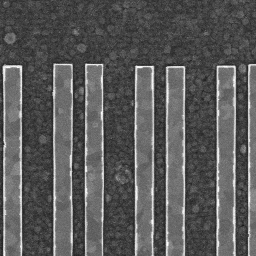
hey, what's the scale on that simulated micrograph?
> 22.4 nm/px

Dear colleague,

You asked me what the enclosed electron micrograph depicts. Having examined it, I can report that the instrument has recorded parallel lines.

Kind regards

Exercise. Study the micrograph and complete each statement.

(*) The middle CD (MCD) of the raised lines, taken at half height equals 386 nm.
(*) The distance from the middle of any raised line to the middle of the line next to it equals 955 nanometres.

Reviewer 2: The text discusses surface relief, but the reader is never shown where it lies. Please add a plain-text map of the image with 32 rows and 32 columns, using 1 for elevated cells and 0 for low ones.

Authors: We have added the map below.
00000000000000000000000000000000
00000000000000000000000000000000
00000000000000000000000000000000
00000000000000000000000000000000
00000000000000000000000000000000
00000000000000000000000000000000
00000000000000000000000000000000
00000000000000000000000000000000
01000001100110000110011000011001
11100001100110000110011000011001
01100001100110000110011000011001
01100001100110000110011000011001
01100001100110000110011000011001
01100001100110000110011000011001
01100001100110000110011000011001
01100001100110000110011000011001
01100001100110000110011000011001
01100001100110000110011000011001
01100001100110000110011000011001
01100001100110000110011000011001
01100001100110000110011000011001
01100001100110000110011000011001
01100001100110000110011000011001
01100001100110000110011000011001
01100001100110000110011000011001
01100001100110000110011000011001
01100001100110000110011000011001
01100001100110000110011000011001
01100001100110000110011000011001
01100001100110000110011000011001
01100001100110000110011000011001
01100001100110000110011000011001